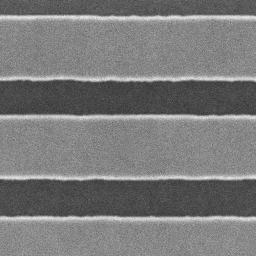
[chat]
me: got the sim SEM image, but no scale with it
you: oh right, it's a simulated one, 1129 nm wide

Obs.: lines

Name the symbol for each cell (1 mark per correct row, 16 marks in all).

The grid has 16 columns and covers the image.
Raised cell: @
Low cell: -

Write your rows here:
----------------
@@@@@@@@@@@@@@@@
@@@@@@@@@@@@@@@@
@@@@@@@@@@@@@@@@
@@@@@@@@@@@@@@@@
----------------
----------------
@@@@@@@@@@@@@@@@
@@@@@@@@@@@@@@@@
@@@@@@@@@@@@@@@@
@@@@@@@@@@@@@@@@
----------------
----------------
----------------
@@@@@@@@@@@@@@@@
@@@@@@@@@@@@@@@@